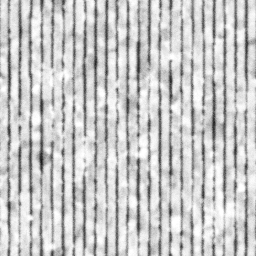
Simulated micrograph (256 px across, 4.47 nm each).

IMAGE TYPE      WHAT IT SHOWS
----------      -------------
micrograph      parallel lines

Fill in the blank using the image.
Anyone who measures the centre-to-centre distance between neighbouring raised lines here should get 48.2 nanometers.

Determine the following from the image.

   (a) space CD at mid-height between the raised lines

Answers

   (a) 12.3 nm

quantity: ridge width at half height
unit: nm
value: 33